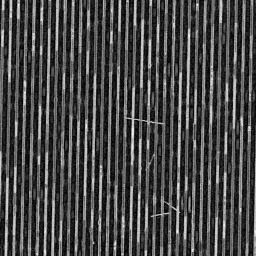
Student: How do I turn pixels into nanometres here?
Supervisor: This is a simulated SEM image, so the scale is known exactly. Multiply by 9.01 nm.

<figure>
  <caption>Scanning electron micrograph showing parallel lines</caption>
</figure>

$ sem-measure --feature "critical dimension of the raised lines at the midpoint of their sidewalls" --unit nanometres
15.8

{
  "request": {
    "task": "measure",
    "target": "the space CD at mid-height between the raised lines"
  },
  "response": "54.1 nanometers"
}